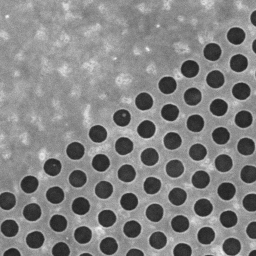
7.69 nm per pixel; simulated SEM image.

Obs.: a regular array of holes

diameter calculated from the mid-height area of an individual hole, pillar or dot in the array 18.1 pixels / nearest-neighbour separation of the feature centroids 212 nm